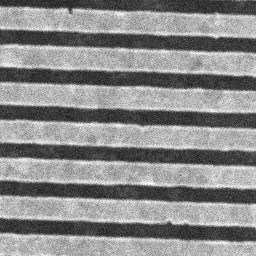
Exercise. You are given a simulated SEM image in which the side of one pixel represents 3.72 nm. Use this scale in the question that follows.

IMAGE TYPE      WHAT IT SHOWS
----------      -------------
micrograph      parallel lines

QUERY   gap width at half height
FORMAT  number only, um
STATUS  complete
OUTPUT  0.0637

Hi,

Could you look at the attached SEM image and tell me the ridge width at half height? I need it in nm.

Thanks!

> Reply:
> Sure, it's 76.7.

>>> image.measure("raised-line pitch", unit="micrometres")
0.141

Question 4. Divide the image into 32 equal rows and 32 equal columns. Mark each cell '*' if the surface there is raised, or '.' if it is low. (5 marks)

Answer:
................................
**************..................
********************************
********************************
.............................***
................................
************************........
********************************
......**************************
................................
***.............................
******************************..
********************************
...............*****************
................................
**********......................
********************************
********************************
.........................*******
................................
******************..............
********************************
..******************************
................................
................................
**************************......
********************************
..........**********************
................................
******..........................
********************************
********************************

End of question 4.